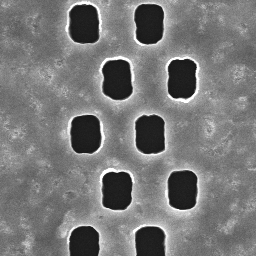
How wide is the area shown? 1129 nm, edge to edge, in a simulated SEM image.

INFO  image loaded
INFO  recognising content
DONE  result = a regular array of holes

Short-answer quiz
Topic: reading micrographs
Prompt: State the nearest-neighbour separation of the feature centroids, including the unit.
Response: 64 pixels